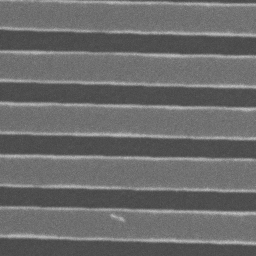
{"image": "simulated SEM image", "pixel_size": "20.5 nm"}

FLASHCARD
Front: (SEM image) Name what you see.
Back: lines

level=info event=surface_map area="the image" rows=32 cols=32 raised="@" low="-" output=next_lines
@@@@@@@@@@@@@@@@@@@@@@@@@@@@----
@@@@@@@@@@@@@@@@@@@@@@@@@@@@@@@@
@@@@@@@@@@@@@@@@@@@@@@@@@@@@@@@@
@@@@@@@@@@@@@@@@@@@@@@@@@@@@@@@@
-------------------------------@
--------------------------------
@@@@@@--------------------------
@@@@@@@@@@@@@@@@@@@@@@@@@@@@@@@@
@@@@@@@@@@@@@@@@@@@@@@@@@@@@@@@@
@@@@@@@@@@@@@@@@@@@@@@@@@@@@@@@@
--------------@@@@@@@@@@@@@@@@@@
--------------------------------
--------------------------------
@@@@@@@@@@@@@@@@@@@@@@@@@@@@@---
@@@@@@@@@@@@@@@@@@@@@@@@@@@@@@@@
@@@@@@@@@@@@@@@@@@@@@@@@@@@@@@@@
@@@@@@@@@@@@@@@@@@@@@@@@@@@@@@@@
--------------------------------
--------------------------------
@@@@@@--------------------------
@@@@@@@@@@@@@@@@@@@@@@@@@@@@@@@@
@@@@@@@@@@@@@@@@@@@@@@@@@@@@@@@@
@@@@@@@@@@@@@@@@@@@@@@@@@@@@@@@@
-----------@@@@@@@@@@@@@@@@@@@@@
--------------------------------
--------------------------------
@@@@@@@@@@@@@@@@@@@@@@@@@@@-----
@@@@@@@@@@@@@@@@@@@@@@@@@@@@@@@@
@@@@@@@@@@@@@@@@@@@@@@@@@@@@@@@@
@@@@@@@@@@@@@@@@@@@@@@@@@@@@@@@@
------------------------------@@
--------------------------------